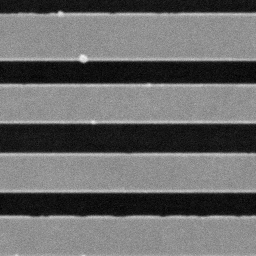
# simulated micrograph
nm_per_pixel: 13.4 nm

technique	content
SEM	lines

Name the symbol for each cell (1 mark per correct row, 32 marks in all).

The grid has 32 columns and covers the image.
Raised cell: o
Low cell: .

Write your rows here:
................................
................................
oooooooooooooooooooooooooooooooo
oooooooooooooooooooooooooooooooo
oooooooooooooooooooooooooooooooo
oooooooooooooooooooooooooooooooo
oooooooooooooooooooooooooooooooo
oooooooooooooooooooooooooooooooo
................................
................................
..................o.............
oooooooooooooooooooooooooooooooo
oooooooooooooooooooooooooooooooo
oooooooooooooooooooooooooooooooo
oooooooooooooooooooooooooooooooo
................................
................................
................................
................................
oooooooooooooooooooooooooooooooo
oooooooooooooooooooooooooooooooo
oooooooooooooooooooooooooooooooo
oooooooooooooooooooooooooooooooo
oooooooooooooooooooooooooooooooo
................................
................................
................................
oooooooooooooooooooooooooooooooo
oooooooooooooooooooooooooooooooo
oooooooooooooooooooooooooooooooo
oooooooooooooooooooooooooooooooo
oooooooooooooooooooooooooooooooo